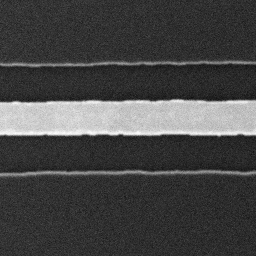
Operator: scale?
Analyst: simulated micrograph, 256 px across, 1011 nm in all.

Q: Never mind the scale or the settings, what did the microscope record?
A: lines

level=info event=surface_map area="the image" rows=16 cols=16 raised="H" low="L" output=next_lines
HHHHHHHHHHHHHHHH
HHHHHHHHHHHHHHHH
HHHHHHHHHHHHHHHH
HHHHHHHHHHHHHHHH
LLLLLLLLLLLLLLLL
LLLLLLLLLLLLLLLL
HHHHHHHHHHHHHHHH
HHHHHHHHHHHHHHHH
LLLLLLLLLLLLLLLL
LLLLLLLLLLLLLLLL
LLLLLLLLLLLLLLLL
HHHHHHHHHHHHHHHH
HHHHHHHHHHHHHHHH
HHHHHHHHHHHHHHHH
HHHHHHHHHHHHHHHH
HHHHHHHHHHHHHHHH